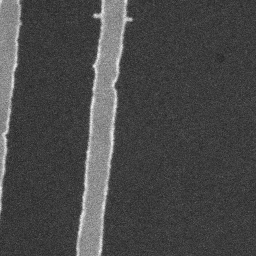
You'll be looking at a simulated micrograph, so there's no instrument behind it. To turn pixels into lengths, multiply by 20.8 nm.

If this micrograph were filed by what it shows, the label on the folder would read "one or a few lines or trenches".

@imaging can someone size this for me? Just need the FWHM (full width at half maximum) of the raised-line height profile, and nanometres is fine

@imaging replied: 469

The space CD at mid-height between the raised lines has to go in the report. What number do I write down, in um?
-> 1.7